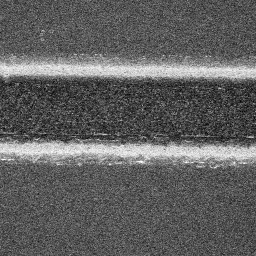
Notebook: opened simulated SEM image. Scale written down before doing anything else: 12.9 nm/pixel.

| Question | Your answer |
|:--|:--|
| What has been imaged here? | one or a few lines or trenches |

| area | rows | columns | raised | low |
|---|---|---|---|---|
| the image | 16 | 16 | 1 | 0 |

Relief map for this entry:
1111111111111111
1111111111111111
1111111111111111
1111111111111111
0000000010011111
0000000000000000
0000000000000000
0000000000000000
0000000000000000
1111111111111101
1111111111111111
1111111111111111
1111111111111111
1111111111111111
1111111111111111
1111111111111111